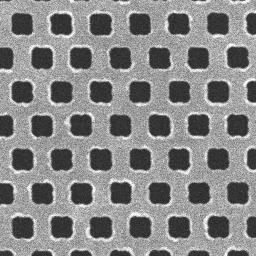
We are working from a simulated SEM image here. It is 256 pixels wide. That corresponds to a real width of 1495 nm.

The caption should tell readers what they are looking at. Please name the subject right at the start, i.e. a regular array of holes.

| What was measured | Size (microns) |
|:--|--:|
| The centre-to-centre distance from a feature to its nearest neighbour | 0.226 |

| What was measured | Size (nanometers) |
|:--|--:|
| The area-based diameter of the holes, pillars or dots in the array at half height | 137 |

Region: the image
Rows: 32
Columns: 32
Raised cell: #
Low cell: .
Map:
################################
################################
#...##...##...##...##...##...##.
#...##...##...##...##...##...##.
################################
################################
..##...##..###..###..##...##...#
..##...##..###..###..##...##...#
.###..###..###..###..###..###..#
################################
##..###..##...##...##...##..###.
#...##...##...##...##...##...##.
##..###..###..##...##...##..###.
################################
.###..###..###..###..###..###..#
..##...##...##..###..###..##...#
..##...##..###..###..###..##...#
################################
################################
##..##...##...##...##...##...##.
##..##...##...##...##...##...##.
################################
################################
..##...##..###..###..###..##...#
..##...##...##..###..###..##...#
.####.####.####.###..###.#######
################################
##..##...##...##...##...##..###.
##..##...##...##...##...##...##.
##..###..###..##...##...##..###.
################################
.###..###..###..###..###..###..#